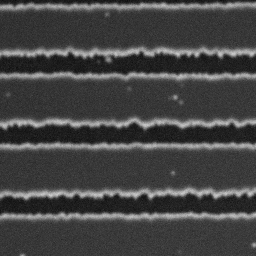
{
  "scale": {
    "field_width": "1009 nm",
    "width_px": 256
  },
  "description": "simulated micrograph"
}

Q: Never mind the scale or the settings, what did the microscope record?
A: lines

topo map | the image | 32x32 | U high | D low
DDDDDDDDDDDDUDDDDDUUUDUDDDUUUUUU
UUUUUUUUUUUUUUUUUUUUUUUUUUUUUUUU
UUUUUUUUUUUUUUUUUUUUUUUUUUUUUUUU
UUUUUUUUUUUUUUUUUUUUUUUUUUUUUUUU
UUUUUUUUUUUUUUUUUUUUUUUUUUUUUUUU
UUUUUUUUUUUUUUUUUUUUUUUUUUUUUUUU
UUUUUUUUUUUUUUUUUUUUUUUUUUUUUUUU
DDDDDDDDDDDDDDDDDDDDDDDDDDDDDDDD
DDDDDDDDDDDDDDDDDDDDDDDDDDDDDDDD
UUUUUUUUUUUUUUUUUUUUUUUUUUUUUUUU
UUUUUUUUUUUUUUUUUUUUUUUUUUUUUUUU
UUUUUUUUUUUUUUUUUUUUUUUUUUUUUUUU
UUUUUUUUUUUUUUUUUUUUUUUUUUUUUUUU
UUUUUUUUUUUUUUUUUUUUUUUUUUUUUUUU
UUUUUUUUUUUUUUUUUUUUUUUUUUUUUUUU
UUUUUUDUUUUUUUUUDUUUDUUUUUUUUUUU
DDDDDDDDDDDDDDDDDDDDDDDDDDDDDDDD
DDDDDDDDDDDDDDDDDDDDDDDDDDDDDDDD
UUUUUUUUUUUUUUUUUUUUUUUUUUUUUUUU
UUUUUUUUUUUUUUUUUUUUUUUUUUUUUUUU
UUUUUUUUUUUUUUUUUUUUUUUUUUUUUUUU
UUUUUUUUUUUUUUUUUUUUUUUUUUUUUUUU
UUUUUUUUUUUUUUUUUUUUUUUUUUUUUUUU
UUUUUUUUUUUUUUUUUUUUUUUUUUUUUUUU
UUUUUDUDUDUUUDDUUDDDDDDDDDDUDDDD
DDDDDDDDDDDDDDDDDDDDDDDDDDDDDDDD
DDDDDDDDDDDDDDDDDDDDDDDDDDDDDDDD
UUUUUUUUUUUUUUUUUUUUUUUUUUUUUUUU
UUUUUUUUUUUUUUUUUUUUUUUUUUUUUUUU
UUUUUUUUUUUUUUUUUUUUUUUUUUUUUUUU
UUUUUUUUUUUUUUUUUUUUUUUUUUUUUUUU
UUUUUUUUUUUUUUUUUUUUUUUUUUUUUUUU